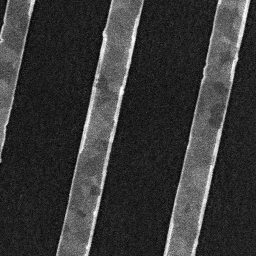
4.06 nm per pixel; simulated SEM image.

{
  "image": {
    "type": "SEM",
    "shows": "one or a few lines or trenches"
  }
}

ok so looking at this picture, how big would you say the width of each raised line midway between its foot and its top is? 121 nm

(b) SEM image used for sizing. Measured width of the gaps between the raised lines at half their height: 74.5 pixels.